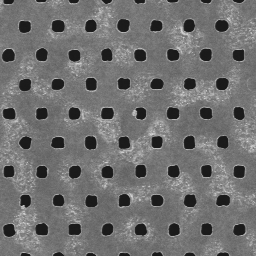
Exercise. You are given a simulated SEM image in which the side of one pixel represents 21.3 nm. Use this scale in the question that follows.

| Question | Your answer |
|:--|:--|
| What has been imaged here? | a regular array of holes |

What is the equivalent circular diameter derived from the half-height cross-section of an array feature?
269 nanometres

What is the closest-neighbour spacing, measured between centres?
0.693 microns